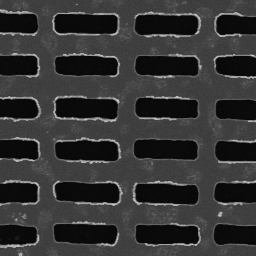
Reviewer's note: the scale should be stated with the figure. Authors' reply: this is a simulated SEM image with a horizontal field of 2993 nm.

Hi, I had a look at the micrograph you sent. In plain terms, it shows a regular array of holes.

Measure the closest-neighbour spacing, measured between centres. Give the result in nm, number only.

484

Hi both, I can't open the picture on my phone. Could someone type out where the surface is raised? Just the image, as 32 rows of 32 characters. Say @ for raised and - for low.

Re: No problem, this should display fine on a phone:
@@@@@@@@@@@@@@@@@@@@@@@@@@@@@@@@
@@@@@@@@@@@@@@@@@@@@@@@@@@@@@@@@
-----@@--------@@--------@@-----
-----@@--------@@--------@@-----
@@@@@@@@@@@@@@@@@@@@@@@@@@@@@@@@
@@@@@@@@@@@@@@@@@@@@@@@@@@@@@@@@
@@@@@@@@@@@@@@@@@@@@@@@@@@@@@@@@
-----@@-------@@@--------@@-----
-----@@--------@@--------@@-----
@@@@@@@@@@@@@@@@@@@-@@@-@@@@@@--
@@@@@@@@@@@@@@@@@@@@@@@@@@@@@@@@
@@@@@@@@@@@@@@@@@@@@@@@@@@@@@@@@
----@@@-------@@@-------@@@@---@
-----@@--------@@--------@@-----
----@@@--------@@--------@@-----
@@@@@@@@@@@@@@@@@@@@@@@@@@@@@@@@
@@@@@@@@@@@@@@@@@@@@@@@@@@@@@@@@
--@@@@@@@@@@@@@@@-------@@@@@@@@
-----@@--------@@--------@@-----
-----@@--------@@--------@@-----
@@@@@@@@@@@@@@@@@@@@@@@@@@@@@@@@
@@@@@@@@@@@@@@@@@@@@@@@@@@@@@@@@
@@@@@@@@@@@@@@@@@@@@@@@@@@@@@@@@
-----@@--------@@--------@@-----
-----@@--------@@--------@@-----
@@@@@@@@@@@@@@@@@@@@@@--@@@@@@@@
@@@@@@@@@@@@@@@@@@@@@@@@@@@@@@@@
@@@@@@@@@@@@@@@@@@@@@@@@@@@@@@@@
----@@@--------@@--------@@-----
-----@@--------@@--------@@-----
---@@@@@@---@@@@@@@--@@@@@@-----
@@@@@@@@@@@@@@@@@@@@@@@@@@@@@@@@